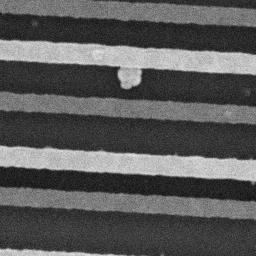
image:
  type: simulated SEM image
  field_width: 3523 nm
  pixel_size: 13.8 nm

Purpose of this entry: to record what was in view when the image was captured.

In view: lines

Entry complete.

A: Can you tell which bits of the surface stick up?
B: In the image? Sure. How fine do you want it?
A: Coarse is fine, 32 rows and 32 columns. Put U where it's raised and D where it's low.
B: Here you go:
UUUUUUUUUUUUUUUUUUUUUDDDDDDDDDDD
UUUUUUUUUUUUUUUUUUUUUUUUUUUUUUUU
DDDDDDDDDDDDDDDDDDUUUUUUUUUUUUUU
DDDDDDDDDDDDDDDDDDDDDDDDDDDDDDDD
DDDDDDDDDDDDDDDDDDDDDDDDDDDDDDDD
UUUUUUUUUUDDDDDDDDDDDDDDDDDDDDDD
UUUUUUUUUUUUUUUUUUUUUUUUUUUDDDDD
DDDUUUUUUUUUUUUUUUUUUUUUUUUUUUUU
DDDDDDDDDDDDDDDUUDDUUUUUUUUUUUUU
DDDDDDDDDDDDDDDUUDDDDDDDDDDDDDDD
DDDDDDDDDDDDDDDDDDDDDDDDDDDDDDDD
DDDDDDDDDDDDDDDDDDDDDDDDDDDDDDDD
UUUUUUUUUUUUUUUUDDDDDDDDDDDDDDDD
UUUUUUUUUUUUUUUUUUUUUUUUUUUUUUUU
DDDDDDDDDDDDDUUUUUUUUUUUUUUUUUUU
DDDDDDDDDDDDDDDDDDDDDDDDDDDDDDDD
DDDDDDDDDDDDDDDDDDDDDDDDDDDDDDDD
DDDDDDDDDDDDDDDDDDDDDDDDDDDDDDDD
UUUUDDDDDDDDDDDDDDDDDDDDDDDDDDDD
UUUUUUUUUUUUUUUUUUUDDDDDDDDDDDDD
UUUUUUUUUUUUUUUUUUUUUUUUUUUUUUUU
DDDDDDDDDDDDUUUUUUUUUUUUUUUUUUUU
DDDDDDDDDDDDDDDDDDDDDDDDDDDDDDDU
UDDDDDDDDDDDDDDDDDDDDDDDDDDDDDDD
UUUUUUUUUUUUUUUUUUDUDDDDDDDDDDDD
UUUUUUUUUUUUUUUUUUUUUUUUUUUUUUUU
DDDDDDDDDDDDDDDDDUUUUUUUUUUUUUUU
DDDDDDDDDDDDDDDDDDDDDDDDDDDDDDDD
DDDDDDDDDDDDDDDDDDDDDDDDDDDDDDDD
DDDDDDDDDDDDDDDDDDDDDDDDDDDDDDDD
DDDDDDDDDDDDDDDDDDDDDDDDDDDDDDDD
UUUUUUDDDDDDDDDDDDDDDDDDDDDDDDDD